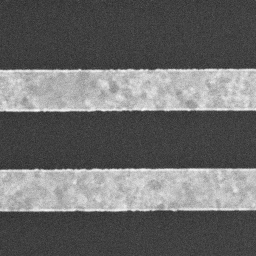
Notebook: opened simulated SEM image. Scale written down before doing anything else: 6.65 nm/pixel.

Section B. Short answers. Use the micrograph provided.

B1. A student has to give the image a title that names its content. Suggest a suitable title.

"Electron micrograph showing lines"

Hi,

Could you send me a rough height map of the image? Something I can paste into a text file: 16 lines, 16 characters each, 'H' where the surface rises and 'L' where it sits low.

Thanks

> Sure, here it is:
LLLLLLLLLLLLLLLL
LLLLLLLLLLLLLLLL
LLLLLLLLLLLLLLLL
LLLLLLLLLLLLLLLL
HHHHHHHHHHHHHHHH
HHHHHHHHHHHHHHHH
HHHHHHHHHHHHHHHH
LLLLLLLLLLLLLLLL
LLLLLLLLLLLLLLLL
LLLLLLLLLLLLLLLL
LLLLLLLLLLLLLLLL
HHHHHHHHHHHHHHHH
HHHHHHHHHHHHHHHH
LLLLLLLLLLLLLLLL
LLLLLLLLLLLLLLLL
LLLLLLLLLLLLLLLL